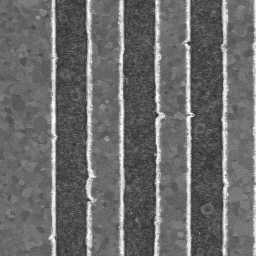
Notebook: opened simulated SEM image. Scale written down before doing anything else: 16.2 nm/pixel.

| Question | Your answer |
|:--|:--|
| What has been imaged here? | one or a few lines or trenches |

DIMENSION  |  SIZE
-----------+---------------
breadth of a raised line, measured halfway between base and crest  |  0.509 um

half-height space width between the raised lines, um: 0.586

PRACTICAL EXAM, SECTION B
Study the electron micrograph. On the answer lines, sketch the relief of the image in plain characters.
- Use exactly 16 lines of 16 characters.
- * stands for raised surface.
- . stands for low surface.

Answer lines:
***...**..**..**
***...**..**..**
***...**..**..**
***...**..**..**
***...**..**..**
***...**..**..**
***...**..**..**
***...**..**..**
***...**..**..**
***...**..**..**
***...**..**..**
***...**..**..**
***...**..**..**
***...**..**..**
***...**..**..**
***..***..**..**